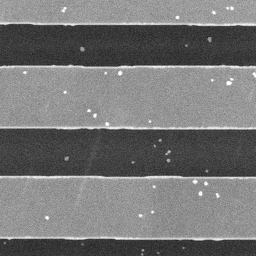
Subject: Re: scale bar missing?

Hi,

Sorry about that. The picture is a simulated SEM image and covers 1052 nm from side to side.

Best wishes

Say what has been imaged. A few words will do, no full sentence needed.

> lines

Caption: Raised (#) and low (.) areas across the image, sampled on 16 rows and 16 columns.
################
#.##############
................
................
################
################
################
################
................
................
................
################
################
################
################
................